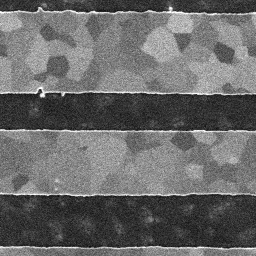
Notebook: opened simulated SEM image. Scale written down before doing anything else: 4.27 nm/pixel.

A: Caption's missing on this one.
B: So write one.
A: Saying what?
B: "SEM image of one or a few lines or trenches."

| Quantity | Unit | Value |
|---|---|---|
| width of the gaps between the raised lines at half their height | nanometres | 190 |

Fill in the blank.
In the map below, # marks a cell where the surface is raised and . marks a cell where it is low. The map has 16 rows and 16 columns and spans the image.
................
################
################
################
################
################
................
................
################
################
################
################
................
................
................
#####.#######...